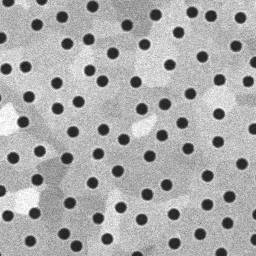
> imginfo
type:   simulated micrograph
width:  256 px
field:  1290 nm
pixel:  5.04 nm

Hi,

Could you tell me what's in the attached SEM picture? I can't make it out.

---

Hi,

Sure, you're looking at a regular array of holes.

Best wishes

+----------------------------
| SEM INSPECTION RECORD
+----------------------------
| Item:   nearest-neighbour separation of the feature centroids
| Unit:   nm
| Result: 131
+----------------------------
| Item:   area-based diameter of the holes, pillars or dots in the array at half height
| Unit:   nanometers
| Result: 60.9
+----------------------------